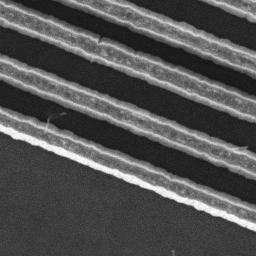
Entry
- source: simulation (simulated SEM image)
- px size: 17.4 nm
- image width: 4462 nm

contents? parallel lines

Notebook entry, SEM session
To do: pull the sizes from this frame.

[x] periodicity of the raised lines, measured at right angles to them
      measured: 849 nm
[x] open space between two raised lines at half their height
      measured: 30.6 pixels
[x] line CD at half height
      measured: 0.321 micrometres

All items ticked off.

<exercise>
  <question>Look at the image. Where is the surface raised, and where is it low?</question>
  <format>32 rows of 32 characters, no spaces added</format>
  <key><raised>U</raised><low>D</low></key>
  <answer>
UDDDDDDDDUUUUUUUDDDDDDDDDDDUUUUU
UUUUDDDDDDDDUUUUUUDDDDDDDDDDDDUU
UUUUUUUDDDDDDDUUUUUUDDDDDDDDDDDD
DDUUUUUUUDDDDDDDDUUUUUUDDDDDDDDD
DDDDDUUUUUUDDDDDDDDDUUUUUUDDDDDD
DDDDDDDUUUUUUUDDDDDDDDUUUUUUDDDD
DDDDDDDDDDUUUUUUDDDDDDDDDUUUUUUD
UDDDDDDDDDDDDUUUUUUDDDDDDDDUUUUU
UUUDDDDDDDDDDDDUUUUUUUDDDDDDDDUU
UUUUUUDDDDDDDDDDDDUUUUUUDDDDDDDD
DDUUUUUUUDDDDDDDDDDDUUUUUUUDDDDD
DDDDDUUUUUUDDDDDDDDDDDDUUUUUUUDD
DDDDDDDUUUUUUUDDDDDDDDDDDUUUUUUU
DDDDDDDDDDUUUUUUDDDDDDDDDDDDUUUU
UUDDDDDDDDDDUUUUUUUDDDDDDDDDDDUU
UUUUUDDDDDDDDDDUUUUUUUDDDDDDDDDD
DUUUUUUDDDDDDDDDDUUUUUUUDDDDDDDD
DDDDUUUUUUDDDDDDDDDDUUUUUUDDDDDD
DDDDDDUUUUUUDDDDDDDDDDDUUUUUUDDD
DDDDDDDDDUUUUUUDDDDDDDDDDUUUUUUU
DDDDDDDDDDDDUUUUUUDDDDDDDDDDUUUU
DDDDDDDDDDDDDDUUUUUUDDDDDDDDDDUU
DDDDDDDDDDDDDDDDDUUUUUUDDDDDDDDD
DDDDDDDDDDDDDDDDDDDUUUUUUDDDDDDD
DDDDDDDDDDDDDDDDDDDDDDUUUUUUDDDD
DDDDDDDDDDDDDDDDDDDDDDDDDUUUUUDD
DDDDDDDDDDDDDDDDDDDDDDDDDDDUUUUU
DDDDDDDDDDDDDDDDDDDDDDDDDDDDDDUU
DDDDDDDDDDDDDDDDDDDDDDDDDDDDDDDD
DDDDDDDDDDDDDDDDDDDDDDDDDDDDDDDD
DDDDDDDDDDDDDDDDDDDDDDDDDDDDDDDD
DDDDDDDDDDDDDDDDDDDDDDDDDDDDDDDD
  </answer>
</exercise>